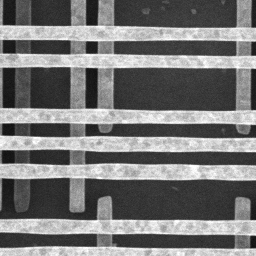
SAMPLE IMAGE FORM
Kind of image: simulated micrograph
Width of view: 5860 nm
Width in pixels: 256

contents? wiring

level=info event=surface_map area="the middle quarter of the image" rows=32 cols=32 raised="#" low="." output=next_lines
################################
................................
................................
................................
................................
................................
................................
................................
................................
................................
................................
...#######......................
################################
################################
################################
................................
................................
................................
##############################..
################################
################################
....############################
................................
................................
................................
################################
################################
################################
........########################
................................
................................
................................